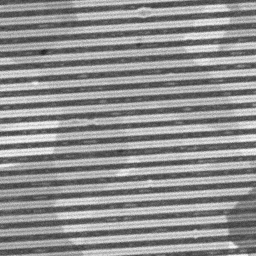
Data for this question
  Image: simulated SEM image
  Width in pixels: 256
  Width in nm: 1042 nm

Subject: parallel lines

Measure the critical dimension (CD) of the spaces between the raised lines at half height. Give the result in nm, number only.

31.5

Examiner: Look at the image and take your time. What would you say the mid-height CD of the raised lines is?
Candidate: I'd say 21.3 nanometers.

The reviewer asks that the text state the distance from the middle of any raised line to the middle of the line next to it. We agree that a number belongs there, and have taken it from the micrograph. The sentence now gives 0.0537 microns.